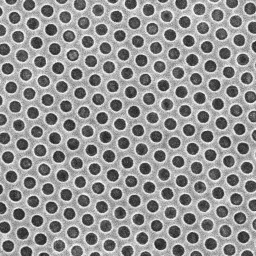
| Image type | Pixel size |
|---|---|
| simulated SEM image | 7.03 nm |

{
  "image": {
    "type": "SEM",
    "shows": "a regular array of holes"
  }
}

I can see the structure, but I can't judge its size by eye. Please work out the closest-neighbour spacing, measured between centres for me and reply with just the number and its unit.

133 nanometers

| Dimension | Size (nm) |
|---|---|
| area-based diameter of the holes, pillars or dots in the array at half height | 87.2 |